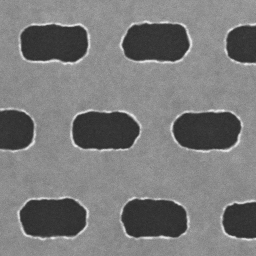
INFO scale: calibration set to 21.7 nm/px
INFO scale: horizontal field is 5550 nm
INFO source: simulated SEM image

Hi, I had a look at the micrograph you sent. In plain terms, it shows holes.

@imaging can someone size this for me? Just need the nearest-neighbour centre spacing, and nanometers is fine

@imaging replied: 2200